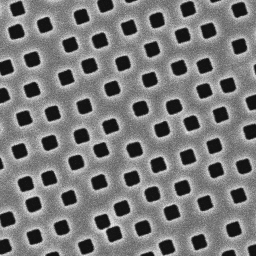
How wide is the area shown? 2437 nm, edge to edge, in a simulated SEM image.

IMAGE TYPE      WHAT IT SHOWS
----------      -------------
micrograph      a regular array of holes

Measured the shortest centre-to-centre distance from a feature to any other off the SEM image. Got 265 nanometres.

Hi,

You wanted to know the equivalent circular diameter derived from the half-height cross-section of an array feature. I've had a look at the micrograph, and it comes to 152 nm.